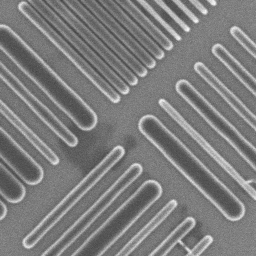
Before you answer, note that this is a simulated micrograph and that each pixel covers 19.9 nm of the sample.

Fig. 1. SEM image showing groups of lines, slits or small figures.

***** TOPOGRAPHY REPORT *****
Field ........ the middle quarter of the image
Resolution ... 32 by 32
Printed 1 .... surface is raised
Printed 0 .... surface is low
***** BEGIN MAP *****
00011100111011101111010000000000
00001110011101110111000000000000
00000111001110111011000000000000
00000011101111011100000000000000
00000001110111101100000000000110
10000000111011110000000000001111
11000000011100110000000000001111
11100000001110000000000000000111
11110000000111000000000000000011
11111000000000000000000011000001
11111100000000000000000011100000
11111110000000000000000001110000
01111111000000000000000000111000
00111111000000000000111000011000
00111111000000000001111100001100
00001111000000000001111110000010
10000000000000000001111111000001
11000000000000000000111111100000
11100000000000000000011111110000
11100000000000000000001111111000
00000000000000000000000111111100
00000000000011100000000011111110
00000000000111100000000001111111
00000000001111000000000000111111
00000000011110000000000000011111
00000000111100000110000000001111
00000001111000001110000000000111
00000011110000011110000000000011
00000111100000111100000000000001
00001111000001111000011000000000
00011110000011110001111100000000
00111100000111100011111100000000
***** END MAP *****